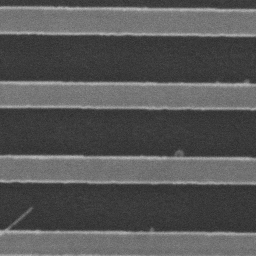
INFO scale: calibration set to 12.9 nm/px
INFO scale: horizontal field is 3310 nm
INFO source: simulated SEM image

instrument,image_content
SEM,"lines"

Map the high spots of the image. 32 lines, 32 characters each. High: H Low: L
LLLLLLLLLLLLLLLLLLLLLLLLLLLLLLLL
HHHHHHHHHHHHHHHHHHHHHHHHHHHHHHHH
HHHHHHHHHHHHHHHHHHHHHHHHHHHHHHHH
HHHHHHHHHHHHHHHHHHHHHHHHHHHHHHHH
LLLLLLLLLLLLLLLLLLLLLLLLLLLLLLLL
LLLLLLLLLLLLLLLLLLLLLLLLLLLLLLLL
LLLLLLLLLLLLLLLLLLLLLLLLLLLLLLLL
LLLLLLLLLLLLLLLLLLLLLLLLLLLLLLLL
LLLLLLLLLLLLLLLLLLLLLLLLLLLLLLLL
LLLLLLLLLLLLLLLLLLLLLLLLLLLLLLLL
HHHHHHHHHHHHHHHHHHHHHHHHHHHHHHLL
HHHHHHHHHHHHHHHHHHHHHHHHHHHHHHHH
HHHHHHHHHHHHHHHHHHHHHHHHHHHHHHHH
LLLLLLLLLLHHHHHHHHHHHHHHHHHHHHHH
LLLLLLLLLLLLLLLLLLLLLLLLLLLLLLLL
LLLLLLLLLLLLLLLLLLLLLLLLLLLLLLLL
LLLLLLLLLLLLLLLLLLLLLLLLLLLLLLLL
LLLLLLLLLLLLLLLLLLLLLLLLLLLLLLLL
LLLLLLLLLLLLLLLLLLLLLLLLLLLLLLLL
LLLLLLLLLLLLLLLLLLLLLLLLLLLLLLLL
HHHHHHHHHHHHHHHHHHHHHHHHHHHHHHHH
HHHHHHHHHHHHHHHHHHHHHHHHHHHHHHHH
HHHHHHHHHHHHHHHHHHHHHHHHHHHHHHHH
LLLLLLLLLLLLLLLLLLLLLLLLLLLLLLLL
LLLLLLLLLLLLLLLLLLLLLLLLLLLLLLLL
LLLLLLLLLLLLLLLLLLLLLLLLLLLLLLLL
LLLLLLLLLLLLLLLLLLLLLLLLLLLLLLLL
LLLLLLLLLLLLLLLLLLLLLLLLLLLLLLLL
LLLLLLLLLLLLLLLLLLLLLLLLLLLLLLLL
HHHHHHHHHHHHHHHHHHHHHHHHHHHHHHHH
HHHHHHHHHHHHHHHHHHHHHHHHHHHHHHHH
HHHHHHHHHHHHHHHHHHHHHHHHHHHHHHHH